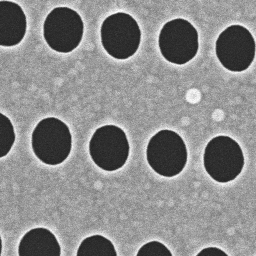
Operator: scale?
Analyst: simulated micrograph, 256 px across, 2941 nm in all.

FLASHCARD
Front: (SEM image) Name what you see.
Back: holes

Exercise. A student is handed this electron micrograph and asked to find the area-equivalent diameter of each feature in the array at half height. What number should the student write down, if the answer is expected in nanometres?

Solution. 500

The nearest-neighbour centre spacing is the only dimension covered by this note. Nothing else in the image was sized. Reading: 663 nm